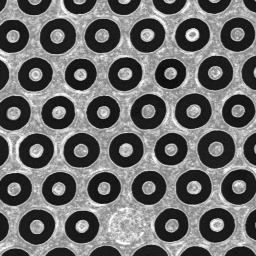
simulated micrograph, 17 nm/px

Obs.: a regular array of ring-shaped grooves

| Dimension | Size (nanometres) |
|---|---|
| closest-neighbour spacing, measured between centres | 746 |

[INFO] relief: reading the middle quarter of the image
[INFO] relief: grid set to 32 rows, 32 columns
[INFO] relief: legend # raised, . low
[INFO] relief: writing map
#.......####.......####.......##
...##...###...###...###..###...#
...##...###...###...###..###...#
...##...###...###..####...##..##
#.......###........####.......##
#......#####......######.....###
###..########....###############
#####################.#########.
.#######....#######.....#####...
..#####......#####.......###....
...###........###...##....##....
...###...##...###..####...##...#
...###..###...##...####...##...#
...###...##...###...#....###....
..####.......####........###....
.######.....######......#####...
################################
###...########....########...###
#.......#####......#####......##
........####........###........#
...##....###..###...###..###...#
...###...##...###...##...###...#
...###...##...###...###...##...#
.........###.......####.......##
#.......####.......#####.....###
##....########...#########.#####
################################
.#######....#######.....######..
..#####......#####.......####...
...###........###...##...###....
...###...##...###...###...##...#
...###...##...###...###...##...#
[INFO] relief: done